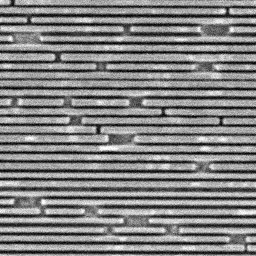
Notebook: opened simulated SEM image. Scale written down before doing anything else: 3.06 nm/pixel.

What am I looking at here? parallel lines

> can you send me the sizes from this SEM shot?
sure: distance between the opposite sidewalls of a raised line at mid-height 0.0172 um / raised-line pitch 27.9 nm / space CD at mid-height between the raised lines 11.5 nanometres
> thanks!